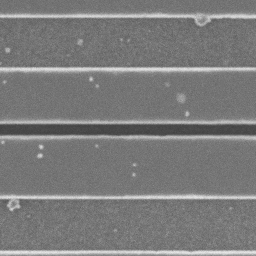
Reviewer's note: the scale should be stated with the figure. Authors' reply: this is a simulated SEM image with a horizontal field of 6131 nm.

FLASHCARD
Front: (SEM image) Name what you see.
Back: lines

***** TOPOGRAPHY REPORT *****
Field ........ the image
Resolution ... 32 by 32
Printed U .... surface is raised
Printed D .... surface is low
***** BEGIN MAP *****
UUUUUUUUUUUUUUUUUUUUUUUUUUUUUUUU
UUUUUUUUUUUUUUUUUUUUUUUUUUUUUUUU
DDDDDDDDDDDDDDDDDDDDDDDDUUDDDDDD
DDDDDDDDDDDDDDDDDDDDDDDDDDDDDDDD
DDDDDDDDDDDDDDDDDDDDDDDDDDDDDDDD
DDDDDDDDDDDDDDDDDDDDDDDDDDDDDDDD
DDDDDDDDDDDDDDDDDDDDDDDDDDDDDDDD
DDDDDDDDDDDDDDDDDDDDDDDDDDDDDDDD
DDDDDDDDDDDDDDDDDDDDDDDDDDDDDDDD
UUUUUUUUUUUUUUUUUUUUUUUUUUUUUUUU
UUUUUUUUUUUUUUUUUUUUUUUUUUUUUUUU
UUUUUUUUUUUUUUUUUUUUUUUUUUUUUUUU
UUUUUUUUUUUUUUUUUUUUUUUUUUUUUUUU
UUUUUUUUUUUUUUUUUUUUUUUUUUUUUUUU
UUUUUUUUUUUUUUUUUUUUUUUUUUUUUUUU
DDDDDDDDDDDDDDDDDDDDDDDDDDUDDDDD
DDDDDDDDDDDDDDDDDDDDDDDDDDDDDDDD
UUUUUUUUUUUUUUUUUUUUUUUUUUUUUUUU
UUUUUUUUUUUUUUUUUUUUUUUUUUUUUUUU
UUUUUUUUUUUUUUUUUUUUUUUUUUUUUUUU
UUUUUUUUUUUUUUUUUUUUUUUUUUUUUUUU
UUUUUUUUUUUUUUUUUUUUUUUUUUUUUUUU
UUUUUUUUUUUUUUUUUUUUUUUUUUUUUUUU
UUUUUUUUUUUUUUUUUUUUUUUUUUUUUUUU
UUUUUUUUUUUUUUUUUUUUUUUUUUUUUUUU
DUDDDDDDDDDDDDDDDDDDDDDDDDDDDDDD
DDDDDDDDDDDDDDDDDDDDDDDDDDDDDDDD
DDDDDDDDDDDDDDDDDDDDDDDDDDDDDDDD
DDDDDDDDDDDDDDDDDDDDDDDDDDDDDDDD
DDDDDDDDDDDDDDDDDDDDDDDDDDDDDDDD
DDDDDDDDDDDDDDDDDDDDDDDDDDDDDDDD
UUUUUUUUUUUUUUUUUUUUUUUUUUUUUUUU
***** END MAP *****